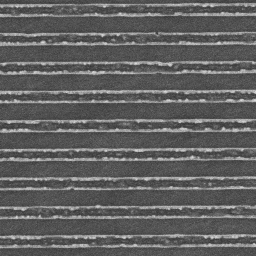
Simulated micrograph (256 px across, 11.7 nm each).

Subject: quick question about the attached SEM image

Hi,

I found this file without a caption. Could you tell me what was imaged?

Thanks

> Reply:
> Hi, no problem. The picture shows parallel lines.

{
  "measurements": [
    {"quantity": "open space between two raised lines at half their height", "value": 198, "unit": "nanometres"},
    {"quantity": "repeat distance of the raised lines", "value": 0.338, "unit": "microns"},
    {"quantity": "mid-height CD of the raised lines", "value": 0.139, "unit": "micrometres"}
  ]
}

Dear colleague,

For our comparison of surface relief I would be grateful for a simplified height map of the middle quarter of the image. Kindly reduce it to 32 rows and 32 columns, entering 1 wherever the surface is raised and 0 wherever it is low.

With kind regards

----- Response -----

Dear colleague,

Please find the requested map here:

11111111111111111111111111111111
11111111111111111111111111111111
00000000000000000000000000000000
00000000000000000000000000000000
00000000000000000000000000000000
00000000000000000000000000000000
00000000000000000000000000000000
11111111111111111111111111111111
11111111111111111111111111111111
11111111111110000000000000000000
00000000000000000000000000000000
00000000000000000000000000000000
00000000000000000000000000000000
00000000000000000000000000000000
11111111111111111111111111111111
11111111111111111111111111111111
11111111111111111111111111111111
00000000000000000000000000000000
00000000000000000000000000000000
00000000000000000000000000000000
00000000000000000000000000000000
11111111111111111111111111111111
11111111111111111111111111111111
11111111111111111111111111111111
00000000000000000000000000000000
00000000000000000000000000000000
00000000000000000000000000000000
00000000000000000000000000000000
00000000000000000001111111111111
11111111111111111111111111111111
11111111111111111111111111111111
00000000000000000000000000000000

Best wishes